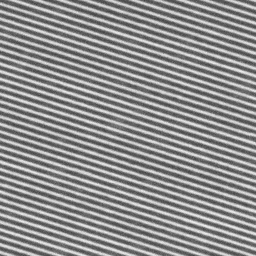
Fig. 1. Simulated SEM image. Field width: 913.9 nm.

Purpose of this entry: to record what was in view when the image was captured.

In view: parallel lines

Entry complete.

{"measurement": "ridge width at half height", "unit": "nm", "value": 9.4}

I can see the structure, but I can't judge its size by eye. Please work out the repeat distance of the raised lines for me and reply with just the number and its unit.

25.6 nanometers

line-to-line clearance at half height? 0.0166 µm